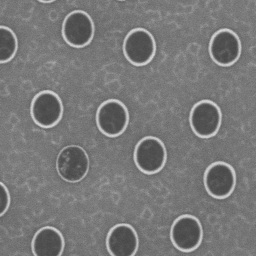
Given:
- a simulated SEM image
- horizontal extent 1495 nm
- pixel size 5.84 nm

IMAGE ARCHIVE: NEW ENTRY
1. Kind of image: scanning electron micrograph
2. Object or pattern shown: a regular array of raised bodies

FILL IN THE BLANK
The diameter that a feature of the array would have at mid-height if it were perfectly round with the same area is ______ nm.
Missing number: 195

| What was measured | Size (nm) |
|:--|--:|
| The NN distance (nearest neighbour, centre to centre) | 368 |